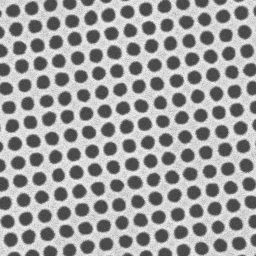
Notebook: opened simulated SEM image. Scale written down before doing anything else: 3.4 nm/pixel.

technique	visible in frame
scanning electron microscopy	a regular array of holes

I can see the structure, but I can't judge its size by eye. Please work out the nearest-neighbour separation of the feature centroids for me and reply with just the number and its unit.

62.4 nm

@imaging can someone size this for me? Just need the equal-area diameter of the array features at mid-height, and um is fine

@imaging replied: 0.0481